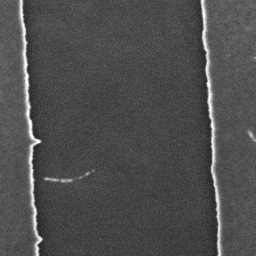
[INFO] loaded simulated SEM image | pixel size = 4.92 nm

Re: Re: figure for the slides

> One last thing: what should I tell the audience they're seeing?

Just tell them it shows one or a few lines or trenches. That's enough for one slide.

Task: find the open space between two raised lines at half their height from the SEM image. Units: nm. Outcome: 892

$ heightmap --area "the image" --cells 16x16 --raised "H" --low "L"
HLLLLLLLLLLLLHHH
HLLLLLLLLLLLLHHH
HHLLLLLLLLLLLHHH
HHLLLLLLLLLLLHHH
HHLLLLLLLLLLLHHH
HHLLLLLLLLLLLHHH
HHLLLLLLLLLLLHHH
HHLLLLLLLLLLLHHH
HHLLLLLLLLLLLHHH
HHLLLLLLLLLLLHHH
HHLLLLLLLLLLLHHH
HHLLLLLLLLLLLHHH
HHLLLLLLLLLLLLHH
HHLLLLLLLLLLLLHH
HHLLLLLLLLLLLLHH
HHLLLLLLLLLLLLHH